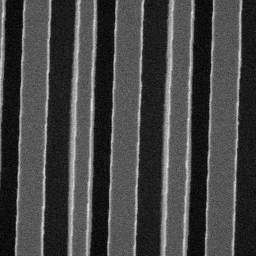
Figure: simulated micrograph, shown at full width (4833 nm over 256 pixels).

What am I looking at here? lines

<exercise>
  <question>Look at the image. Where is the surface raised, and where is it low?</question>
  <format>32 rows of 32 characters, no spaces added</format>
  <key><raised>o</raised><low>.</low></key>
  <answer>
o..ooo....oo...ooo....oo...ooo..
o..ooo....oo..oooo....oo...ooo..
...ooo....oo..oooo....oo...ooo..
...ooo....oo..oooo...ooo...ooo..
...ooo....oo..oooo...ooo...ooo..
...ooo....oo..oooo...ooo...ooo..
...ooo....oo..oooo...ooo..oooo..
...ooo....oo..oooo...ooo..oooo..
...ooo....oo..oooo...ooo..oooo..
...ooo....oo..oooo...ooo..oooo..
...ooo....oo..oooo...ooo..oooo..
...ooo...ooo..oooo...ooo..oooo..
...ooo...ooo..oooo...ooo..oooo..
...ooo...ooo..ooo....ooo..oooo..
...ooo...ooo..ooo....ooo..oooo..
...ooo...ooo..ooo....ooo..oooo..
...ooo...ooo..ooo....ooo..oooo..
..oooo...oo...ooo....ooo..oooo..
..oooo...oo...ooo....ooo..oooo..
..oooo...oo...ooo....ooo..oooo..
..oooo...oo...ooo....oo...oooo..
..oooo...oo...ooo....oo...ooo...
..oooo...oo...ooo....oo...ooo...
..oooo...oo...ooo....oo...ooo...
..ooo....oo...ooo....oo...ooo...
..ooo....oo...ooo....oo...ooo...
..ooo....oo...ooo....oo...ooo...
..ooo....oo...ooo....oo...ooo...
..ooo....oo...ooo....oo...ooo...
..ooo....oo...ooo....oo...ooo...
..ooo....oo...ooo....oo...ooo...
..ooo....oo...ooo....oo...ooo...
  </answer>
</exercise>